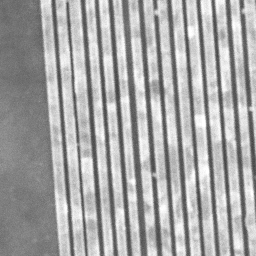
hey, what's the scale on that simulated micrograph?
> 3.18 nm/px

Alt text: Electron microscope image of parallel lines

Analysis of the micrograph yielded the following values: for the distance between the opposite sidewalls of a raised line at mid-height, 26.9 nanometers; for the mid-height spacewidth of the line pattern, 0.0182 microns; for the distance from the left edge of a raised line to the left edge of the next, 46 nanometres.